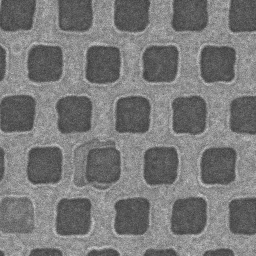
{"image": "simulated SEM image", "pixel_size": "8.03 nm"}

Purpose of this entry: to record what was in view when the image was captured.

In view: a regular array of holes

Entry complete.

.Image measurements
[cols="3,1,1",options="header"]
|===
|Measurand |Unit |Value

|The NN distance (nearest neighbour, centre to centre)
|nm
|458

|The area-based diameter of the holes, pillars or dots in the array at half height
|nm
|319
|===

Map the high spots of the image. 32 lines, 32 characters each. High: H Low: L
LLLLHHHLLLLLHHLLLLLHHHLLLLHHHLLL
LLLLHHHLLLLLHHLLLLLHHHLLLLHHHLLL
LLLLHHHLLLLLHHLLLLLHHLLLLLHHHLLL
LLLLHHHLLLLHHHHLLLHHHHLLLLHHHLLL
HHHHHHHHHHHHHHHHHHHHHHHHHHHHHHHH
HHHHHHHHHHHHHHHHHHHHHHHHHHHHHHHH
LHHHLLLLHHHLLLLHHHLLLLHHHLLLLHHH
LHHLLLLLHHHLLLLHHHLLLLHHHLLLLHHH
LHHLLLLLHHHLLLLHHHLLLLHHHLLLLHHH
LHHHLLLLHHHLLLLHHHLLLLHHHLLLLHHH
HHHHHHHHHHHHHHHHHHHHHHHHHHHHHHHH
HHHHHHHHHHHHHHHHHHHHHHHHHHHHHHHH
LLLLHHHLLLLHHHHLLLLHHHLLLLHHHLLL
LLLLLHHLLLLLHHLLLLLHHHLLLLHHHLLL
LLLLHHHLLLLHHHLLLLLHHHLLLLHHHLLL
LLLLHHHLLLLHHHLLLLLHHHLLLLHHHLLL
HHLHHHHHLLLHHHHLLLHHHHLLLHHHHLLL
HHHHHHHHHHHLLLHHHHHHHHHHHHHHHHHH
HHHHLLLHHLLLLLLHHHHLLLHHHHLLLHHH
LHHHLLLLHLLLLLLHHHLLLLHHHLLLLLHH
LHHLLLLLHLLLLLLHHHLLLLHHHLLLLLHH
LHHLLLLLHLLLLLLHHHLLLLHHHLLLLHHH
HHHHLLLLHLLLLLLHHHLLLLHHHLLLLHHH
HHHHHHHHHHHHLLHHHHHHHHHHHHHHHHHH
HHHHHHHHHHHHHHHHHHHHHHHHHHHHHHHH
LLLLHHHLLLLHHHLLLLLHHHLLLLHHHLLL
LLLLHHHLLLLHHHLLLLLHHLLLLLHHHLLL
LLLLHHHLLLLHHHLLLLLHHLLLLLHHHLLL
LLLLHHHLLLLHHHLLLLLHHLLLLLHHHLLL
HHHHHHHHHHHHHHHHHHHHHHHHHHHHHHHH
HHHHHHHHHHHHHHHHHHHHHHHHHHHHHHHH
HHHHLLLLHHHLLLLHHHLLLLHHHHLLLHHH